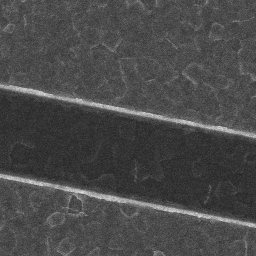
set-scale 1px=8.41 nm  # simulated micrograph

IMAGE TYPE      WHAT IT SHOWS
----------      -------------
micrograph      one or a few lines or trenches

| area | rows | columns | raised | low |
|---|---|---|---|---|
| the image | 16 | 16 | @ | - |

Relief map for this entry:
@@@@@@@@@@@@@@@@
@@@@@@@@@@@@@@@@
@@@@@@@@@@@@@@@@
@@@@@@@@@@@@@@@@
@@@@@@@@@@@@@@@@
-@@@@@@@@@@@@@@@
------@@@@@@@@@@
-----------@@@@@
----------------
----------------
----------------
@@@-------------
@@@@@@@@--------
@@@@@@@@@@@@@---
@@@@@@@@@@@@@@@@
@@@@@@@@@@@@@@@@